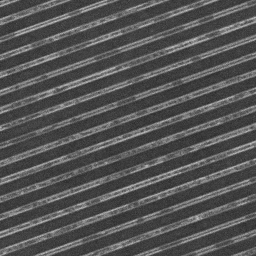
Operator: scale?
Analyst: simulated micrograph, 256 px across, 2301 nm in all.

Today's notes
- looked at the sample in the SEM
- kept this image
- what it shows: parallel lines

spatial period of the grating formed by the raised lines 150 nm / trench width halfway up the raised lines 0.104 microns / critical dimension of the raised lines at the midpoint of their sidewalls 0.0519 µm